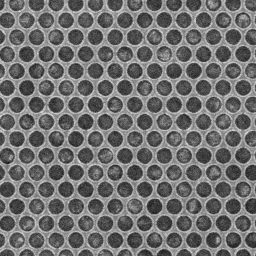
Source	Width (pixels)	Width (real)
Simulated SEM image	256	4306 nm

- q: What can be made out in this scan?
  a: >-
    a regular array of holes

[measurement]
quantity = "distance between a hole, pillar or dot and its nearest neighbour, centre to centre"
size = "325 nanometres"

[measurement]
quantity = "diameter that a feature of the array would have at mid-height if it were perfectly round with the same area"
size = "16.6 px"